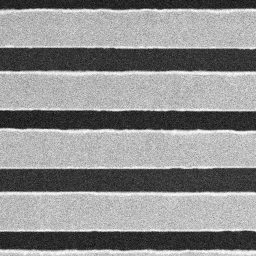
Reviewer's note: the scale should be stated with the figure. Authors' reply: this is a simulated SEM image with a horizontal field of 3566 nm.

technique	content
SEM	lines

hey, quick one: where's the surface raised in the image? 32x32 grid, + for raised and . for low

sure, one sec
................................
++++++++++++++++++++++++++++++++
++++++++++++++++++++++++++++++++
++++++++++++++++++++++++++++++++
++++++++++++++++++++++++++++++++
++++++++++++++++++++++++++++++++
................................
................................
................................
++++++++++++++++++++++++++++++++
++++++++++++++++++++++++++++++++
++++++++++++++++++++++++++++++++
++++++++++++++++++++++++++++++++
++++++++++++++++++++++++++++++++
................................
................................
++++++++++++++++++++++++++++++++
++++++++++++++++++++++++++++++++
++++++++++++++++++++++++++++++++
++++++++++++++++++++++++++++++++
++++++++++++++++++++++++++++++++
................................
................................
................................
++++++++++++++++++++++++++++++++
++++++++++++++++++++++++++++++++
++++++++++++++++++++++++++++++++
++++++++++++++++++++++++++++++++
++++++++++++++++++++++++++++++++
................................
................................
++++++++++++++++++++++++++++++++